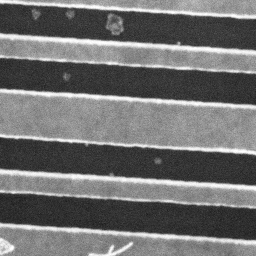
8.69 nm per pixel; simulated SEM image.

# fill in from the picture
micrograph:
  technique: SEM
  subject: lines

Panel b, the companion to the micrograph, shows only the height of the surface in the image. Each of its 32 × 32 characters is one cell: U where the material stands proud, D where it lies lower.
DDDUUUUUUUUUUUUUUUUUUUUUUUUUUUUU
DDDDDDDDDDDDDDDDDDUUUUUUUUUUUUUU
DDDDDDDDDDDDDDDDDDDDDDDDDDDDDDDD
DDDDDDDDDDDDDDDDDDDDDDDDDDDDDDDD
UUUUDDDDDDDDDDDDDDDDDDDDDDDDDDDD
UUUUUUUUUUUUUUUUUUUDDDDDDDDDDDDD
UUUUUUUUUUUUUUUUUUUUUUUUUUUUUUUU
DDDDDUUUUUUUUUUUUUUUUUUUUUUUUUUU
DDDDDDDDDDDDDDDDDDDDDDUUUUUUUUUU
DDDDDDDDDDDDDDDDDDDDDDDDDDDDDDDD
DDDDDDDDDDDDDDDDDDDDDDDDDDDDDDDD
UUUUUDDDDDDDDDDDDDDDDDDDDDDDDDDD
UUUUUUUUUUUUUUUUUUUUDDDDDDDDDDDD
UUUUUUUUUUUUUUUUUUUUUUUUUUUUUUUU
UUUUUUUUUUUUUUUUUUUUUUUUUUUUUUUU
UUUUUUUUUUUUUUUUUUUUUUUUUUUUUUUU
UUUUUUUUUUUUUUUUUUUUUUUUUUUUUUUU
DDDDDUUUUUUUUUUUUUUUUUUUUUUUUUUU
DDDDDDDDDDDDDDDDDDDUUUUUUUUUUUUU
DDDDDDDDDDDDDDDDDDDDDDDDDDDDDDDD
DDDDDDDDDDDDDDDDDDDDDDDDDDDDDDDD
UUUUDDDDDDDDDDDDDDDDDDDDDDDDDDDD
UUUUUUUUUUUUUUUUUUUUDDDDDDDDDDDD
UUUUUUUUUUUUUUUUUUUUUUUUUUUUUUUU
DDDDDDDDDUUUUUUUUUUUUUUUUUUUUUUU
DDDDDDDDDDDDDDDDDDDDDDDDUUUUUUUU
DDDDDDDDDDDDDDDDDDDDDDDDDDDDDDDD
DDDDDDDDDDDDDDDDDDDDDDDDDDDDDDDD
UUUUUUUDDDDDDDDDDDDDDDDDDDDDDDDD
UUUUUUUUUUUUUUUUUUUUUUUUDDDDDDDD
UUUUUUUUUUUUUUUUUUUUUUUUUUUUUUUU
UUUUUUUUUUUUUUUUUUUUUUUUUUUUUUUU